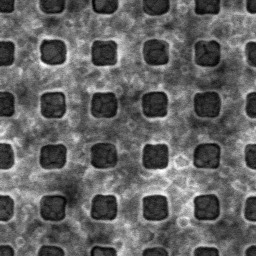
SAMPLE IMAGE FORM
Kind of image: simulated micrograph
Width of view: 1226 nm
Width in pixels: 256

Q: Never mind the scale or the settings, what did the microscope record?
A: a regular array of holes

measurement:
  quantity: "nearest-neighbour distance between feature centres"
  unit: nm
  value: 245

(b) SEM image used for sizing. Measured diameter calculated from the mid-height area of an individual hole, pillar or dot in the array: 136 nm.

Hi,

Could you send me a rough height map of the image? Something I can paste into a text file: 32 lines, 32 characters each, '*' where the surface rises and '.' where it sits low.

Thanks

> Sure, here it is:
..***...***....***...***....***.
.****...****..****...***...****.
********************************
********************************
********************************
..***...****...***...***...****.
..***...***....***...***....***.
..***...***....***...***...****.
********************************
********************************
********************************
.*****.************.******.*****
..***...***....***...***....***.
..***...***....***...***....***.
.****...****..****..*****..****.
********************************
********************************
********************************
.****...***...****...***....***.
..***...***....***...***....***.
..***...***....***...***...****.
********************************
********************************
********************************
.*****..****..****..*****..*****
..***...***....***...***...****.
..***...***....***...***...***..
.*****..*****.****..*****..****.
********************************
********************************
********************************
..***...***....***...***...****.